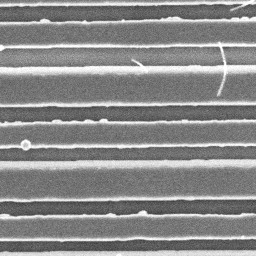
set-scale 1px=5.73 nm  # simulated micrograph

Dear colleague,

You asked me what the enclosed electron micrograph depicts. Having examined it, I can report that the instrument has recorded lines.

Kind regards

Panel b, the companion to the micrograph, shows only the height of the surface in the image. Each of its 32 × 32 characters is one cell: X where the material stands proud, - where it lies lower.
XXXXXXXXXXXXXXXXXXXXXXXXX-----X-
--------------------------------
--------------------------------
XXXXXXXXXXXXXXXXXXXXXXXXXXXXXXXX
XXXXXXXXXXXXXXXXXXXXXXXXXXXXXXXX
XXXXXXXXXXXXXXXXXXXXXXXXXXXXXXXX
--------------------------------
--------------------------------
-----------------XX----XX--XXXXX
XXXXXXXXXXXXXXXXXXXXXXXXXXXXXXXX
XXXXXXXXXXXXXXXXXXXXXXXXXXXXXXXX
XXXXXXXXXXXXXXXXXXXXXXXXXXXXXXXX
XXXXXXXXXXXXXXXXXXXXXXXXXXXXXXXX
--------------------------------
--------------------------------
XXXXXXXXXXXXXXXXXXXXXXXXXXXXXXXX
XXXXXXXXXXXXXXXXXXXXXXXXXXXXXXXX
XXXXXXXXXXXXXXXXXXXXXXXXXXXXXXXX
--XX----------------------------
--------------------------------
XXXXXXXXXXXXXXXXXXXXXXXXXXXXXXXX
XXXXXXXXXXXXXXXXXXXXXXXXXXXXXXXX
XXXXXXXXXXXXXXXXXXXXXXXXXXXXXXXX
XXXXXXXXXXXXXXXXXXXXXXXXXXXXXXXX
XXXXXXXXXXXXXXXXXXXXXXXXXXXXXXXX
--------------------------------
--------------------------------
XXXXXXXXXXXXXXXXXXXXXXXXXXXXXXXX
XXXXXXXXXXXXXXXXXXXXXXXXXXXXXXXX
XXXXXXXXXXXXXXXXXXXXXXXXXXXXXXXX
--------------------------------
--------------------------------